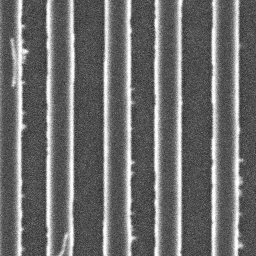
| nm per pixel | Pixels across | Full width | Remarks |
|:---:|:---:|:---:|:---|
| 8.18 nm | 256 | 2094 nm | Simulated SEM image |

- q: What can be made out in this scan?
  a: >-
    lines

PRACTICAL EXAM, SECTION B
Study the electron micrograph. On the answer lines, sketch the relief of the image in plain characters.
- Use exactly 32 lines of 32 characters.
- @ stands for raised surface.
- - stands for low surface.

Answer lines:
@@@---@@@----@@@----@@@----@@@--
@@@---@@@----@@@----@@@----@@@--
@@@---@@@----@@@----@@@----@@@--
@@@---@@@----@@@----@@@----@@@--
@@@---@@@----@@@----@@@----@@@--
@@@---@@@----@@@----@@@----@@@--
@@@---@@@----@@@----@@@----@@@--
@@@---@@@----@@@---@@@@----@@@--
@@@---@@@----@@@---@@@@----@@@--
@@@---@@@----@@@---@@@@----@@@--
@@@---@@@----@@@---@@@@----@@@--
@@@---@@@----@@@----@@@----@@@--
@@@---@@@----@@@----@@@----@@@--
@@@---@@@----@@@---@@@@----@@@--
@@@---@@@----@@@----@@@----@@@--
@@@---@@@----@@@---@@@@----@@@--
@@@---@@@----@@@---@@@@----@@@--
@@@---@@@----@@@----@@@----@@@--
@@@---@@@----@@@----@@@----@@@--
@@@---@@@----@@@----@@@----@@@--
@@@---@@@----@@@---@@@@----@@@--
@@@---@@@----@@@----@@@----@@@--
@@@---@@@----@@@----@@@----@@@--
@@@---@@@----@@@----@@@----@@@--
@@@---@@@----@@@----@@@----@@@--
@@@---@@@----@@@----@@@----@@@--
@@@---@@@----@@@----@@@----@@@--
@@@---@@@----@@@----@@@----@@@--
@@@---@@@----@@@----@@@----@@@--
@@@---@@@----@@@----@@@----@@@--
@@@---@@@----@@@----@@@----@@@--
@@@---@@@----@@@---@@@-----@@@--